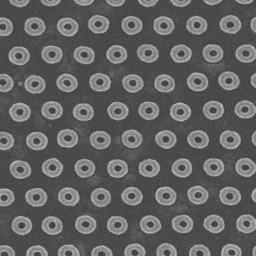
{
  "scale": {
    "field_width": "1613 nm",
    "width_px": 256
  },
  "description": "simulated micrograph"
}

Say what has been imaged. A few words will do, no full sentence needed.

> a regular array of ring-shaped raised bodies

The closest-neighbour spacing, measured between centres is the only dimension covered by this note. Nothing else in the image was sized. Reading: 0.198 um